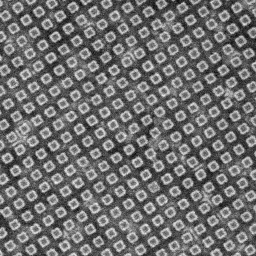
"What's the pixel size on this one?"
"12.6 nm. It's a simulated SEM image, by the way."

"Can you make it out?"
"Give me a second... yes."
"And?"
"a regular array of raised bodies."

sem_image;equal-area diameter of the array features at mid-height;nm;117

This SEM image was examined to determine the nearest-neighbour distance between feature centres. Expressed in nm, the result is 188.